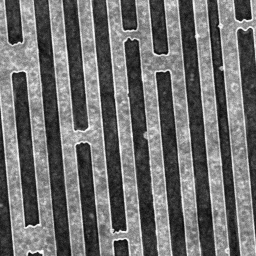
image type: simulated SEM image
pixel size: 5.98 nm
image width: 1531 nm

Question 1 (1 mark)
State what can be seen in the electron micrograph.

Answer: parallel lines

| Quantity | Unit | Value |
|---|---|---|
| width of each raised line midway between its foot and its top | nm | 78.1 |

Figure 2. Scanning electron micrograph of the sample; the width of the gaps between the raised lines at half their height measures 15.6 pixels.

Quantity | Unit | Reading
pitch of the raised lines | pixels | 28.3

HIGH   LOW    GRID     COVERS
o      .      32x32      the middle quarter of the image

o....ooo....ooo....ooooooooooo..
o....ooo....ooo.....oooooooooo..
o....ooo....oooo....ooo....ooo..
o....ooo.....ooo....ooo....ooo..
o....ooo.....ooo....ooo....ooo..
o.....ooo....ooo....ooo....ooo..
o.....ooo....ooo....ooo....ooo..
oo....ooo....ooo....ooo....ooo..
oo....ooo....ooo....ooo....ooo..
oo....ooo....ooo....ooo....oooo.
oo....ooo....ooo....ooo.....ooo.
oo....ooo....ooo....oooo....ooo.
oo....ooo....ooo.....ooo....ooo.
oo....ooo....oooo....ooo....ooo.
oo....ooo.....ooo....ooo....ooo.
oo....ooo.....ooo....ooo....ooo.
ooo..ooooo....ooo....ooo....ooo.
oooooooooo....ooo....ooo....ooo.
oooooooooo....ooo....ooo....ooo.
oooo..oooo....ooo....ooo....ooo.
ooo....ooo....ooo....ooo....oooo
ooo....ooo....ooo....ooo.....ooo
ooo....ooo....ooo....oooo....ooo
ooo....ooo....ooo.....ooo....ooo
ooo....ooo....ooo.....ooo....ooo
ooo....ooo.....ooo....ooo....ooo
ooo....ooo.....ooo....ooo....ooo
ooo....oooo....ooo....ooo....ooo
ooo.....ooo....ooo....ooo....ooo
oooo....ooo....ooo....ooo....ooo
.ooo....ooo....ooo....ooo....ooo
.ooo....ooo....ooo....ooo....ooo